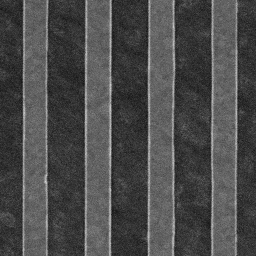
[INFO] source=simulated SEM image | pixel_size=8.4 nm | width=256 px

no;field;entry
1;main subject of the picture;one or a few lines or trenches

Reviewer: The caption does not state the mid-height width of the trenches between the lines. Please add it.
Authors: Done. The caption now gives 321 nm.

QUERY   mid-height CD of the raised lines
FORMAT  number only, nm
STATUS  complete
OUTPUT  208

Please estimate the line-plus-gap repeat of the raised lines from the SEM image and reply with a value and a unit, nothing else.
530 nm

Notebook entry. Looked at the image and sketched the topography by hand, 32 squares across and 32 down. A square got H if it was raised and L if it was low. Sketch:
LLLHHHLLLLLHHHLLLLLHHHLLLLLHHHLL
LLLHHHLLLLLHHHLLLLLHHHLLLLLHHHLL
LLLHHHLLLLLHHHLLLLLHHHLLLLLHHHLL
LLLHHHLLLLLHHHLLLLLHHHLLLLLHHHLL
LLLHHHLLLLLHHHLLLLLHHHLLLLLHHHLL
LLLHHHLLLLLHHHLLLLLHHHLLLLLHHHLL
LLLHHHLLLLLHHHLLLLLHHHLLLLLHHHLL
LLLHHHLLLLLHHHLLLLLHHHLLLLLHHHLL
LLLHHHLLLLLHHHLLLLLHHHLLLLLHHHLL
LLLHHHLLLLLHHHLLLLLHHHLLLLLHHHLL
LLLHHHLLLLLHHHLLLLLHHHLLLLLHHHLL
LLLHHHLLLLLHHHLLLLLHHHLLLLLHHHLL
LLLHHHLLLLLHHHLLLLLHHHLLLLLHHHLL
LLLHHHLLLLLHHHLLLLLHHHLLLLLHHHLL
LLLHHHLLLLLHHHLLLLLHHHLLLLLHHHLL
LLLHHHLLLLLHHHLLLLLHHHLLLLLHHHLL
LLLHHHLLLLLHHHLLLLLHHHLLLLLHHHLL
LLLHHHLLLLLHHHLLLLLHHHLLLLLHHHLL
LLLHHHLLLLLHHHLLLLLHHHLLLLLHHHLL
LLLHHHLLLLLHHHLLLLLHHHLLLLLHHHLL
LLLHHHLLLLLHHHLLLLLHHHLLLLLHHHLL
LLLHHHLLLLLHHHLLLLLHHHLLLLLHHLLL
LLLHHHLLLLLHHHLLLLLHHHLLLLLHHLLL
LLLHHHLLLLLHHHLLLLLHHHLLLLLHHLLL
LLLHHHLLLLLHHHLLLLLHHHLLLLLHHLLL
LLLHHHLLLLLHHHLLLLLHHHLLLLLHHLLL
LLLHHHLLLLLHHHLLLLLHHHLLLLLHHLLL
LLLHHHLLLLLHHHLLLLLHHHLLLLLHHLLL
LLLHHHLLLLLHHHLLLLLHHHLLLLLHHLLL
LLLHHHLLLLLHHHLLLLLHHHLLLLLHHLLL
LLLHHHLLLLLHHHLLLLLHHHLLLLLHHLLL
LLLHHHLLLLLHHHLLLLLHHHLLLLHHHLLL